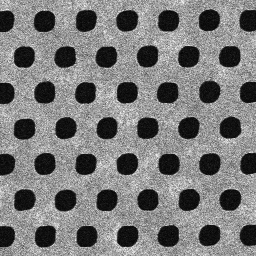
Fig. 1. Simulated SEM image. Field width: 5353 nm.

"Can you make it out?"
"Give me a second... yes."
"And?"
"a regular array of holes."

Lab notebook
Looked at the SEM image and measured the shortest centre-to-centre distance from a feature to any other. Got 855 nanometres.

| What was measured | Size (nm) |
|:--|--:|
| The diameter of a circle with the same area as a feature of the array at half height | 464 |